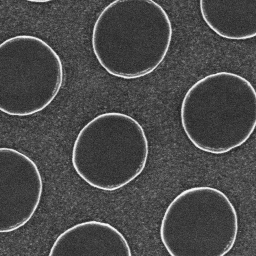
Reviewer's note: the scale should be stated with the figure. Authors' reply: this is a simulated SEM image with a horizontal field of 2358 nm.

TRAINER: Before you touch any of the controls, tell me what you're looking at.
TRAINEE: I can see raised bodies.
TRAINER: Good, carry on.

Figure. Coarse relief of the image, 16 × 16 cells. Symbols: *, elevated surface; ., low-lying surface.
.......***...***
......*****..***
.*....*****.....
****..****......
****...**.......
****........****
***........*****
......**...*****
.....****...****
*....****....*..
**...****.......
***...**........
**.........***..
**........*****.
....***...*****.
...*****..****..